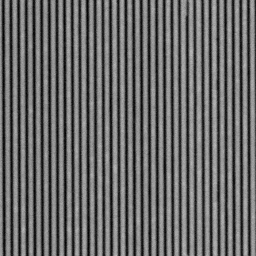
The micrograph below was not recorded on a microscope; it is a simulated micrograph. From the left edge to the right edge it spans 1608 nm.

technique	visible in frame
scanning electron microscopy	parallel lines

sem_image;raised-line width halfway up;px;5.37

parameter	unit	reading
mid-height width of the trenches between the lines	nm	17.3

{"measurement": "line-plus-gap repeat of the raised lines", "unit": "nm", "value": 48.1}